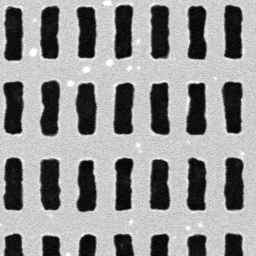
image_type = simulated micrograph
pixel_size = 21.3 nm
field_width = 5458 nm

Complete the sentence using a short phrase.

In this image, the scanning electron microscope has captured a regular array of holes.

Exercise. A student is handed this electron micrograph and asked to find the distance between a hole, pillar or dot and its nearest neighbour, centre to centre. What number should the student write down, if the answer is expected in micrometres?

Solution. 0.771